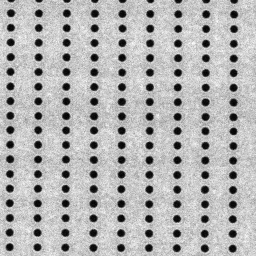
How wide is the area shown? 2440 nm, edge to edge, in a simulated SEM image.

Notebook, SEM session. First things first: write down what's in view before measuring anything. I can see a regular array of holes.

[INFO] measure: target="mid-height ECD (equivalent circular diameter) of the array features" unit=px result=7.73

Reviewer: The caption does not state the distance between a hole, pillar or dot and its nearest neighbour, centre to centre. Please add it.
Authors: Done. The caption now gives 138 nanometres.